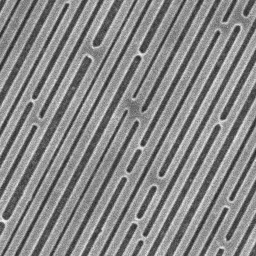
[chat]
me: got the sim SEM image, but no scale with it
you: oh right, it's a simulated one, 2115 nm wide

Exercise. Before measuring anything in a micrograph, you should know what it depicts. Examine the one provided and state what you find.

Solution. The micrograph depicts parallel lines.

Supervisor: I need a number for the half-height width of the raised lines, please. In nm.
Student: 69.5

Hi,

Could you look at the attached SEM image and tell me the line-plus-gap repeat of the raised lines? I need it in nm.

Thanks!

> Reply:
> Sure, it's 122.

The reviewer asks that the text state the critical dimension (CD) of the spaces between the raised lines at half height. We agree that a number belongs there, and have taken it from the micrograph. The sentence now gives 48.4 nanometres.